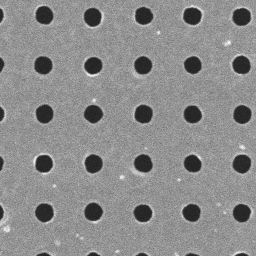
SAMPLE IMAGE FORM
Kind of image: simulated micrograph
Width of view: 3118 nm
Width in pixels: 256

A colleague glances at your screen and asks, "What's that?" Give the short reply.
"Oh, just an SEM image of a regular array of holes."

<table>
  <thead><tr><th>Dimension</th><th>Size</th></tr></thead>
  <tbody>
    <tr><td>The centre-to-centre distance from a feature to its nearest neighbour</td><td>594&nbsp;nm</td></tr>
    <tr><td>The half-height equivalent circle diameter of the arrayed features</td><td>224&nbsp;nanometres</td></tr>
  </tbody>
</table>